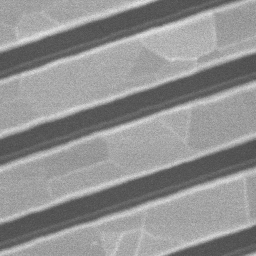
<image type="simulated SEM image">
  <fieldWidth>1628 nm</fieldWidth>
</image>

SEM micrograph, lines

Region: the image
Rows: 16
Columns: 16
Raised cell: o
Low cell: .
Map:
oooooooo......oo
ooooo......ooooo
oo......oooooooo
.....oooooooooo.
..oooooooooo....
ooooooooo......o
oooooo......oooo
ooo......ooooooo
......oooooooooo
...oooooooooo...
oooooooooo......
ooooooo......ooo
oooo......oooooo
o......ooooooooo
....ooooooooooo.
.oooooooooo.....